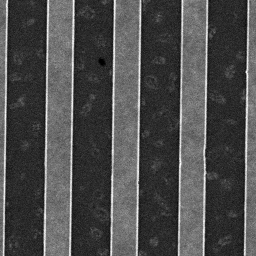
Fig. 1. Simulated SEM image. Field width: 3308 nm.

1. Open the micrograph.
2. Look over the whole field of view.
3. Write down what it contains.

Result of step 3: one or a few lines or trenches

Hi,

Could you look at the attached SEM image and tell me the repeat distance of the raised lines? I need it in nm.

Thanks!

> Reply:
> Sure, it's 864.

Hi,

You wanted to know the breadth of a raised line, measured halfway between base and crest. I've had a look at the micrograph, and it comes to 328 nm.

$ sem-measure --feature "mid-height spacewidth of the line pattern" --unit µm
0.534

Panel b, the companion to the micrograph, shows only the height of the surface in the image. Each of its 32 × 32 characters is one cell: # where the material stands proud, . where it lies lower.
#.....###.....####.....###.....#
#.....###.....####.....###.....#
#.....###.....####.....###.....#
#.....###.....###......###.....#
#.....###.....###......###.....#
#.....###.....###......###.....#
#.....###.....###......###.....#
#.....###.....###......###.....#
#.....###.....###......###.....#
#.....###.....###......###.....#
#.....###.....###......###.....#
#.....###.....###......###.....#
#.....###.....###......###.....#
#.....###.....###......###.....#
#.....###.....###......###.....#
#.....###.....###......###.....#
#.....###.....###......###.....#
#.....###.....###......###.....#
#.....###.....###......###.....#
#.....###.....###......##......#
#.....###.....###......##......#
#.....###.....###......###.....#
#.....###.....###......##......#
#.....###.....###.....###......#
#.....###.....###.....###......#
......###.....###.....###......#
......###.....###.....###......#
......###.....###.....###......#
......###.....###.....###......#
......###.....###.....###......#
......###.....###.....###......#
......###.....###.....###......#